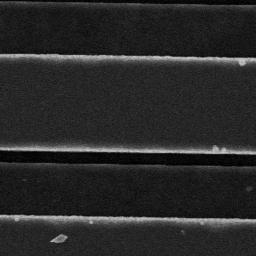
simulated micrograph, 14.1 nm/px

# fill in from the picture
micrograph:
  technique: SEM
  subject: lines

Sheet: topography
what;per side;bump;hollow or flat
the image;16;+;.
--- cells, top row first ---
................
................
................
+++++++.........
++++++++++++++++
++++++++++++++++
++++++++++++++++
++++++++++++++++
++++++++++++++++
.........+++++++
................
................
................
++..............
++++++++++++++++
++++++++++++++++